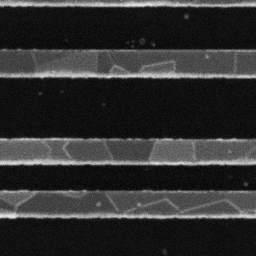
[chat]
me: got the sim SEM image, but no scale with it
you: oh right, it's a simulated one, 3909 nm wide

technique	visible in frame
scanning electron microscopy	lines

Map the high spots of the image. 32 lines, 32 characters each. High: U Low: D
UUUUUUUUUUUUUUUUUUUUUUUUUUUUUUUU
DDDDDDDDDDDDDDDDDDDDDDDDDDDDDDDD
DDDDDDDDDDDDDDDDDDDDDDDDDDDDDDDD
DDDDDDDDDDDDDDDDDDDDDDDDDDDDDDDD
DDDDDDDDDDDDDDDDDDDDDDDDDDDDDDDD
DDDDDDDDDDDDDDDDDDDDDDDDDDDDDDDD
UUUUUUUUUUUUUUUUUUUUUUUUUUUUUUUU
UUUUUUUUUUUUUUUUUUUUUUUUUUUUUUUU
UUUUUUUUUUUUUUUUUUUUUUUUUUUUUUUU
DDDDDDDDDDDDDUUUDDDDDDDDDUUDUUUU
DDDDDDDDDDDDDDDDDDDDDDDDDDDDDDDD
DDDDDDDDDDDDDDDDDDDDDDDDDDDDDDDD
DDDDDDDDDDDDDDDDDDDDDDDDDDDDDDDD
DDDDDDDDDDDDDDDDDDDDDDDDDDDDDDDD
DDDDDDDDDDDDDDDDDDDDDDDDDDDDDDDD
DDDDDDDDDDDDDDDDDDDDDDDDDDDDDDDD
DDDDDDDDDDDDDDDDDDDDDDDDDDDDDDDD
UDUUUUUUUUUUUUUDUUUUUUDDDDDDDDDD
UUUUUUUUUUUUUUUUUUUUUUUUUUUUUUUU
UUUUUUUUUUUUUUUUUUUUUUUUUUUUUUUU
DDDDDDDDDDDDDDDDDDDDDDDDDDDDDDDD
DDDDDDDDDDDDDDDDDDDDDDDDDDDDDDDD
DDDDDDDDDDDDDDDDDDDDDDDDDDDDDDDD
DDDDDDDDDDDDDDDDDDDDDDDDDDDDDDDD
UUUUUUUUUUUUUUUUUUUUUUUUUUUUUUUU
UUUUUUUUUUUUUUUUUUUUUUUUUUUUUUUU
UUUUUUUUUUUUUUUUUUUUUUUUUUUUUUUU
DDDDDDDDDDDDDDDDDDDDDDDDDDDDDDDD
DDDDDDDDDDDDDDDDDDDDDDDDDDDDDDDD
DDDDDDDDDDDDDDDDDDDDDDDDDDDDDDDD
DDDDDDDDDDDDDDDDDDDDDDDDDDDDDDDD
DDDDDDDDDDDDDDDDDDDDDDDDDDDDDDDD